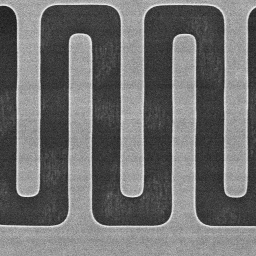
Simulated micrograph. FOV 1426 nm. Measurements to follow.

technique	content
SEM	groups of lines, slits or small figures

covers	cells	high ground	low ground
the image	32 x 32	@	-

@@@@@@@@@@@@@@@@@@@@@@@@@@@@@@@@
--@@@@---------@@@----------@@@-
--@@@----------@@@----------@@@-
--@@@----------@@@----------@@@-
--@@@----@@----@@@----@@----@@@-
--@@@----@@----@@@----@@----@@@-
--@@@----@@----@@@----@@----@@@-
--@@@----@@----@@@----@@----@@@-
--@@@----@@----@@@----@@----@@@-
--@@@----@@----@@@----@@----@@@-
--@@@----@@----@@@----@@----@@@-
--@@@----@@----@@@----@@----@@@-
--@@@----@@----@@@----@@----@@@-
--@@@----@@----@@@----@@----@@@-
--@@@----@@----@@@----@@----@@@-
--@@@----@@----@@@----@@----@@@-
--@@@----@@----@@@----@@----@@@-
--@@@----@@----@@@----@@----@@@-
--@@@----@@----@@@----@@----@@@-
--@@@----@@----@@@----@@----@@@-
--@@@----@@----@@@----@@----@@@-
--@@@----@@----@@@----@@----@@@-
--@@@----@@----@@@----@@----@@@-
--@@@----@@----@@@----@@----@@@-
---@-----@@-----@-----@@-----@--
---------@@-----------@@--------
---------@@----------@@@@-------
--------@@@@---------@@@@-------
@@@@@@@@@@@@@@@@@@@@@@@@@@@@@@@@
@@@@@@@@@@@@@@@@@@@@@@@@@@@@@@@@
@@@@@@@@@@@@@@@@@@@@@@@@@@@@@@@@
@@@@@@@@@@@@@@@@@@@@@@@@@@@@@@@@